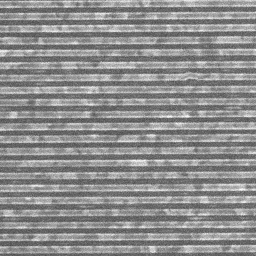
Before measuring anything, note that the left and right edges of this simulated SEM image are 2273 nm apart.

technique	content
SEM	parallel lines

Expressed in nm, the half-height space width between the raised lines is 58.8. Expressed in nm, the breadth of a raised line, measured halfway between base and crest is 51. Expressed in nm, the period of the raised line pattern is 109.